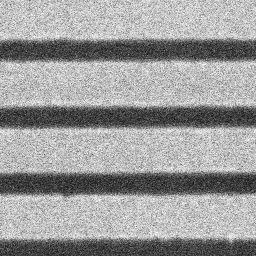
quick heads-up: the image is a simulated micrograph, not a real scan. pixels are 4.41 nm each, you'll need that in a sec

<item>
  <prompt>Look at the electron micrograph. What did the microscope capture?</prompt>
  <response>one or a few lines or trenches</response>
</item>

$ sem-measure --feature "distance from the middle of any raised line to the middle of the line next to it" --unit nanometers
294